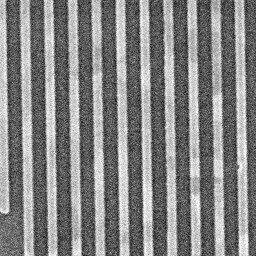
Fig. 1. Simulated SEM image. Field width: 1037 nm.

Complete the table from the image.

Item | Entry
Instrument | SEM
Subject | parallel lines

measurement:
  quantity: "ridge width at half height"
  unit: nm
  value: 32.9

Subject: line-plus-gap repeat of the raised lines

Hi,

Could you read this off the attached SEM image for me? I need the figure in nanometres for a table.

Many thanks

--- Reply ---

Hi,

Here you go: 96.6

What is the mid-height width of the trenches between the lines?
0.0618 microns